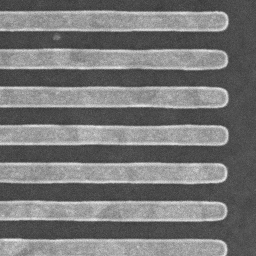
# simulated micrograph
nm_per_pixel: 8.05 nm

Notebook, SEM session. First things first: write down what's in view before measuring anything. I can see wiring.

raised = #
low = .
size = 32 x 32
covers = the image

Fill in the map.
................................
################..........##....
############################....
############################....
................................
................................
############################....
############################....
.........###.......########.....
................................
................................
############################....
############################....
................................
................................
................................
############################....
############################....
................................
................................
############################....
############################....
############################....
................................
................................
############################....
############################....
.............#############......
................................
................................
############################....
############################....